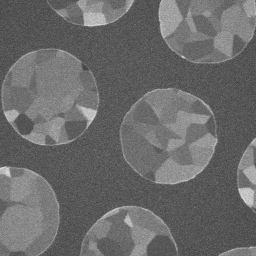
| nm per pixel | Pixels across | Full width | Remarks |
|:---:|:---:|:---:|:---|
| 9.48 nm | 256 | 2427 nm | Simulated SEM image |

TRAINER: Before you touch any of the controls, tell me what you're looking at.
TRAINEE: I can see raised bodies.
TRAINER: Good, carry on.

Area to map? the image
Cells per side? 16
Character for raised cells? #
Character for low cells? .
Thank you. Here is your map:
...#####..######
.....##...######
..........######
..###......####.
.#####..........
######..........
######..#####...
.#####..#####...
.####...######..
........#####..#
#.......#####..#
###............#
####...........#
####...###......
####..#####.....
###..######....#